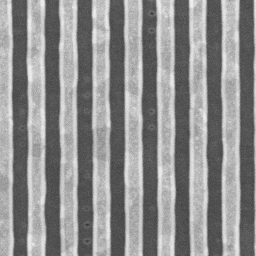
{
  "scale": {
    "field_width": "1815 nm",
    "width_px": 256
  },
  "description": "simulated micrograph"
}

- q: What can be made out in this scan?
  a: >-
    wiring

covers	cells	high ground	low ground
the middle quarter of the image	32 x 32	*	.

***.....***.....***.....***.....
***.....***.....***.....***.....
***.....***.....***.....***.....
***.....***.....***.....***.....
***.....***.....***.....***.....
***.....***.....***.....***.....
***.....***.....***.....***.....
***.....***.....***.....***.....
***.....***.....***.....***.....
***.....***.....***.....***.....
***.....***.....***.....***.....
***.....***.....***.....***.....
***.....***.....***.....***.....
***.....***.....***.....***.....
***.....***.....***.....***.....
***.....***.....***.....***.....
***.....***.....***.....***.....
***.....***.....***.....***.....
***.....***.....***.....***.....
***.....***.....***.....***.....
***.....***.....***.....***.....
***.....***.....***.....***.....
***.....***.....***.....***.....
***.....***.....***.....***.....
***.....***.....***.....***.....
***.....***.....***.....***.....
***.....***.....***.....***.....
***.....***.....***.....***.....
***.....***.....***.....***.....
***.....***.....***.....***.....
***.....***.....***.....***.....
***.....***.....***.....***.....